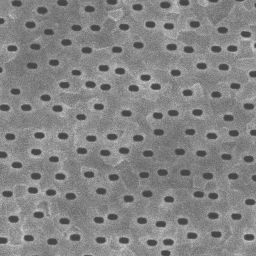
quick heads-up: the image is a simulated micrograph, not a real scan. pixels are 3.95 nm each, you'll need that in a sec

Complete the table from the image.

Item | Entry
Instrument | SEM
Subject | a regular array of holes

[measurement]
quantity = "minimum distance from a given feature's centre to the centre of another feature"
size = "0.0753 um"